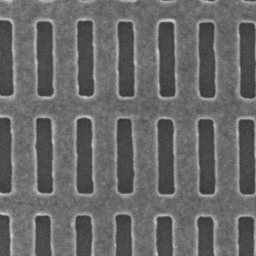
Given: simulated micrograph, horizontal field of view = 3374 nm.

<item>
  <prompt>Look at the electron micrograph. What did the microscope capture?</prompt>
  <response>a regular array of holes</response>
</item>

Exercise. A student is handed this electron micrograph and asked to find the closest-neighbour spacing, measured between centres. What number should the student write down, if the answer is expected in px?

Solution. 40.6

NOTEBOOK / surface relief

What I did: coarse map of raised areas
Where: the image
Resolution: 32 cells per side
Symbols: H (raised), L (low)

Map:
HHHHHHHHHHHHHHHHHHHHHHHHHHHHHHHH
HHHHHHHHHHHHHHHHHHHHHHHHHHHHHHHH
LHHHHHHHHHLHHHHHHHHHHHHHHHHHHHHH
LLHHHLLHHHLLHHHLLHHHLLHHHLLHHHLL
LLHHHLLHHHLLHHHLLHHHLLHHHLLHHHLL
LLHHHLLHHHLLHHHLLHHHLLHHHLLHHHLL
LLHHHLLHHHLLHHHLLHHHLLHHHLLHHHLL
LLHHHLLHHHLLHHHLLHHHLLHHHLLHHHLL
LLHHHLLHHHLLHHHLLHHHLLHHHLLHHHLL
LLHHHLLHHHLLHHHLLHHHLLHHHLLHHHLL
LLHHHLLHHHLLHHHLLHHHLLHHHLLHHHLL
LLHHHLLHHHLLHHHLLHHHLLHHHLLHHHLL
HHHHHHHHHHHHHHHHHHHHHHHHHHHHHHHH
HHHHHHHHHHHHHHHHHHHHHHHHHHHHHHHH
HHHHHHHHHHHHHHHHHHHHHHHHHHHHHHHH
LHHHLLHHHLLLHHHLHHHHLLHHHLLHHHLL
LHHHLLLHHLLLHHHLLHHHLLHHHLLHHHLL
LLHHLLLHHLLLHHLLLHHHLLHHHLLHHHLL
LLHHLLLHHLLLHHHLLHHHLLHHHLLHHHLL
LLHHLLLHHHLLHHHLLHHHLLHHHLLHHHLL
LLHHLLLHHHLLHHHLLHHHLLHHHLLHHHLL
LLHHHLLHHHLLHHHLLHHHLLHHHLLHHHLL
LHHHHLLHHHLLHHHLLHHHLLHHHLLHHHLL
LHHHHLLHHHLLHHHLLHHHLLHHHLLHHHLL
HHHHHHHHHHHHHHHHHHHHHHHHHHHHHHHH
HHHHHHHHHHHHHHHHHHHHHHHHHHHHHHHH
HHHHHHHHHHHHHHHHHHHHHHHHHHHHHHHH
LHHHLLHHHLLHHHLLHHHHLLHHHLLHHHLL
LHHHLLHHHLLLHHLLLHHHLLHHHLLHHHLL
LHHHLLHHHLLLHHLLLHHLLLHHHLLHHHLL
LHHHLLHHHLLLHHLLLHHLLLHHHLLHHHLL
LHHHLLLHHLLLHHLLLHHHLLHHHLLHHHLL